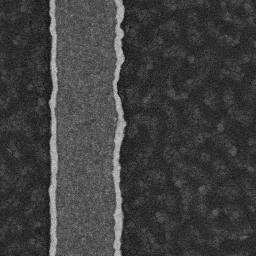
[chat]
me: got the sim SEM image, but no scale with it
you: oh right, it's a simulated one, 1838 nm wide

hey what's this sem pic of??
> one or a few lines or trenches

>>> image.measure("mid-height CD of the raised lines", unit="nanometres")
469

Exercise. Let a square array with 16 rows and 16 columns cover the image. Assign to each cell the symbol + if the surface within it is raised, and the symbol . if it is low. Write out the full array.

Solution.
...+++++........
...++++.........
...++++.........
...+++++........
...++++.........
...++++.........
...++++.........
...+++++........
...+++++........
...++++.........
...++++.........
...++++.........
...++++.........
...++++.........
...++++.........
...++++.........